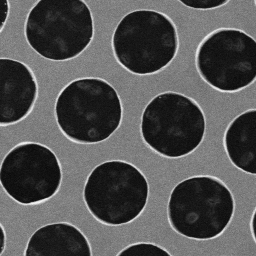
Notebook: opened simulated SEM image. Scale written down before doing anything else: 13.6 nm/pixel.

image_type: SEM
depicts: holes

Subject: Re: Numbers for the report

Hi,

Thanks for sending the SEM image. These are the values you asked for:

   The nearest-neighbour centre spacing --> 1160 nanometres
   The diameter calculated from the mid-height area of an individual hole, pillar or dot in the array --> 861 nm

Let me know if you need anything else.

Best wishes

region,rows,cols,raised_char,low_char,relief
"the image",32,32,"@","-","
-@@@@------@@@@@@@@@@@@-----@@@@
-@@@-------@@@@@@--@@@@@@@@@@@@@
-@@--------@@@@------@@@@@@@@@@@
@@@---------@@@-------@@@@@@@@@@
@@@--------@@@--------@@@@-----@
@@@@-------@@@--------@@@-------
@@@@@-----@@@@--------@@@-------
-@@@@@@-@@@@@@@------@@@@-------
---@@@@@@@@@@@@@----@@@@@-------
----@@@@@@@@@@@@@@@@@@@@@-------
----@@@@@----@@@@@@@@@@@@@-----@
----@@@@------@@@@@@@@@@@@@@@@@@
----@@@--------@@@@-----@@@@@@@@
----@@@--------@@@-------@@@@@@@
---@@@@--------@@@-------@@@@@--
@@@@@@@--------@@@--------@@@---
@@@@@@@@------@@@@-------@@@----
@@@@@@@@@@---@@@@@-------@@@----
@@----@@@@@@@@@@@@@-----@@@@----
@------@@@@@@@@@@@@@@--@@@@@@---
-------@@@@@@---@@@@@@@@@@@@@---
--------@@@@-----@@@@@@@@@@@@@@-
--------@@@-------@@@@@----@@@@@
@------@@@@-------@@@@------@@@@
@-----@@@@@-------@@@--------@@@
@@@@@@@@@@@-------@@@--------@@@
@@@@@@@@@@@------@@@@--------@@@
@@@@@@@@@@@@@---@@@@@--------@@@
@@@@@----@@@@@@@@@@@@@------@@@@
-@@@------@@@@@@@@@@@@@----@@@@@
-@@@-------@@@@@@-@@@@@@@@@@@@@@
@@@--------@@@@------@@@@@@@@@@@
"